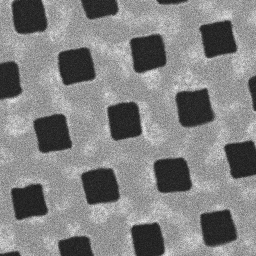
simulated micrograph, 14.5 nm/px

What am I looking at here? a regular array of holes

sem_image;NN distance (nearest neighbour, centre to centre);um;1.03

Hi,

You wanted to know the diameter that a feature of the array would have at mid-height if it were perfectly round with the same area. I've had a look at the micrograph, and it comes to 551 nm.